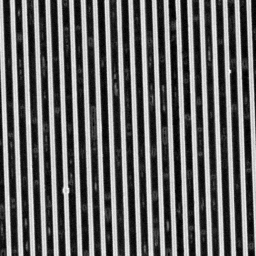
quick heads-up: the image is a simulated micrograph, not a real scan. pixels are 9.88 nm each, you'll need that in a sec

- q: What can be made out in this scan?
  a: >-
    parallel lines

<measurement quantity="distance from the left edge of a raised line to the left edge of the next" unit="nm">117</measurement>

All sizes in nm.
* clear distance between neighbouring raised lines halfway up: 72.8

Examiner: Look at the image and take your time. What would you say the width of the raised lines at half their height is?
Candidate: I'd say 45.6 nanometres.